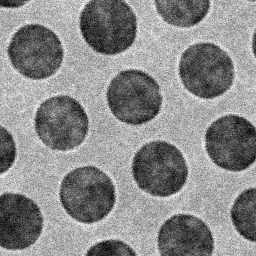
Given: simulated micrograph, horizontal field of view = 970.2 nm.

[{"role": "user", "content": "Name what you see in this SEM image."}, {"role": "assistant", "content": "holes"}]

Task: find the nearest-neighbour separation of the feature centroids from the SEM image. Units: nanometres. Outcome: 289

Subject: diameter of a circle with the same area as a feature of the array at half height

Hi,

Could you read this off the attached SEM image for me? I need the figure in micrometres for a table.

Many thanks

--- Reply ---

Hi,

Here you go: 0.217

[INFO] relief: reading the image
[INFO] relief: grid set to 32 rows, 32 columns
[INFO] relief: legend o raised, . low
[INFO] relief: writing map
...oooooooo.....ooo.......oooooo
oooooooooo.......ooo......oooooo
oooooooooo.......ooo.....ooooooo
oo....oooo.......ooooo..oooooooo
o......ooo.......ooooooooooooooo
o.......ooo......ooooooo...oooo.
o.......oooo....ooooooo.....oooo
o.......oooooooooooooo.......ooo
oo......oooooooooooooo.......ooo
ooo....ooooooo.....ooo.......ooo
oooooooooooooo......ooo......ooo
ooooooooooooo.......oooo....oooo
oooooo....ooo.......oooooooooooo
ooooo.....oooo......oooooooooooo
oooo.......ooo......oooooooo..oo
oooo.......ooooo..oooooooo......
.oooo......ooooooooooooooo......
..ooo......oooooooooooooo.......
..oooo....ooooooo.....oooo......
..ooooooooooooooo......ooo......
..oooooooooooooo.......oooo.....
.oooooooo....ooo........ooooo.oo
oooooooo......ooo......ooooooooo
ooooooo.......ooo......oooooooo.
...oooo........oooo...oooooooo..
.....ooo......ooooooooooooooo...
.....ooo......ooooooooooooooo...
......ooo....oooooooo....oooo...
.....ooooooooooooooo......ooo...
.....ooooooooooooooo.......ooo..
....oooooooo....oooo.......ooooo
ooooooooooo......ooo.......ooooo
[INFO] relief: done